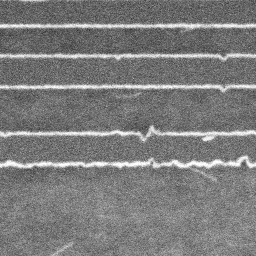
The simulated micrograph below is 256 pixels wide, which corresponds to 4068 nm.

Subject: one or a few lines or trenches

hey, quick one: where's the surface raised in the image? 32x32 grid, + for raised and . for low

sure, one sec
++++++++++++++++++++++++++++++++
++++++++++++++++++++++++++++++++
++++++++++++++++++++++++++++++++
................................
................................
................................
................................
++++++++++++++++++++++++++++++++
++++++++++++++++++++++++++++++++
++++++++++++++++++++++++++++++++
++++++++++++++++++++++++++++++++
................................
................................
................................
................................
................................
...................+............
++++++++++++++++++++++++++++++++
++++++++++++++++++++++++++++++++
++++++++++++++++++++++++++++++++
+.++++++++++++++++.++.+++++.++.+
................................
................................
................................
................................
................................
................................
................................
................................
................................
................................
................................